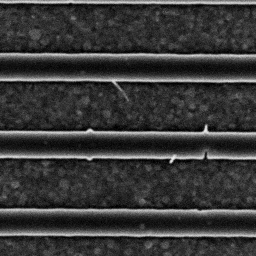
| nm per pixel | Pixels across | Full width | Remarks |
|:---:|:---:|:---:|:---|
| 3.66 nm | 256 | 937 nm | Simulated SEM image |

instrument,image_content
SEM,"one or a few lines or trenches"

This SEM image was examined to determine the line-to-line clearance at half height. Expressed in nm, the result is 186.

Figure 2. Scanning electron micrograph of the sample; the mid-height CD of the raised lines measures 96.5 nanometers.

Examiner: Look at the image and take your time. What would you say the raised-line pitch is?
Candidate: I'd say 0.284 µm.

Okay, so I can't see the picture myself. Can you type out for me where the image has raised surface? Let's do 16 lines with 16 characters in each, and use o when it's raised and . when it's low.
................
................
................
oooooooooooooooo
oooooooooooooooo
................
................
................
oooooooooooooooo
oooooooooooooooo
................
................
................
oooooooooooooooo
oooooooooooooooo
................